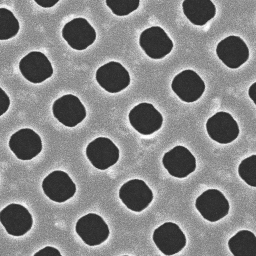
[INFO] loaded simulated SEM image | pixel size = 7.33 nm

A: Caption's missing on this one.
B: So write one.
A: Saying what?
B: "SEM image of a regular array of holes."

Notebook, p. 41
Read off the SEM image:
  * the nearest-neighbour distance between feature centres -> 397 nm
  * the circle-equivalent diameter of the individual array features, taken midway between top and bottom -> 235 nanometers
